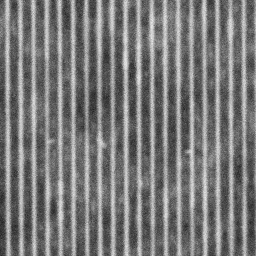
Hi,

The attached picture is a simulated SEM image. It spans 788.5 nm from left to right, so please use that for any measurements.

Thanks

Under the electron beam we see parallel lines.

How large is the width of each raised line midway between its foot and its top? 8.8 nm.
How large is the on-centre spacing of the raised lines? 0.0404 micrometres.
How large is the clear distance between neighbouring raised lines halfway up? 0.0319 um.